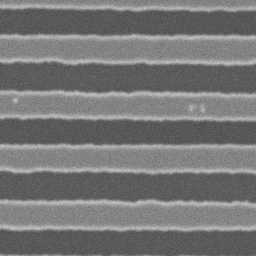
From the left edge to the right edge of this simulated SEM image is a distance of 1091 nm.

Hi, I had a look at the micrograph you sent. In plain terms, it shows lines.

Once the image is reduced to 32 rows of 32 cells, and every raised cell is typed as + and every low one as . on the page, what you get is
++++++++++++++++++++++++++++++++
................................
................................
................................
++++++++++++..+++++...++++++++.+
++++++++++++++++++++++++++++++++
++++++++++++++++++++++++++++++++
++++++++++++++++++++++++++++++++
................................
................................
................................
++++++++++....+..++.............
++++++++++++++++++++++++++++++++
++++++++++++++++++++++++++++++++
++++++++++++++++++++++++++++++++
................................
................................
................................
++++++++++++++++++++++++++++++++
++++++++++++++++++++++++++++++++
++++++++++++++++++++++++++++++++
...+.............++++++.+++.++.+
................................
................................
................................
++++++++++++++++++++++++++++++++
++++++++++++++++++++++++++++++++
++++++++++++++++++++++++++++++++
++++++++++++++++++++++++++++++++
................................
................................
................................